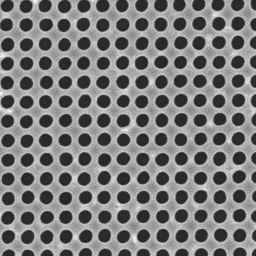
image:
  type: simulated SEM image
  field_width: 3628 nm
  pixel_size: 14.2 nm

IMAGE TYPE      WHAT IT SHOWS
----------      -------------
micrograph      a regular array of holes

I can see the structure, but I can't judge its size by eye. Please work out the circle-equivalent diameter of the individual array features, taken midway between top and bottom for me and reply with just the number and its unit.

194 nm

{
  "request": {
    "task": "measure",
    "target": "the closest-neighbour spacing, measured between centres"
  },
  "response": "266 nm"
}